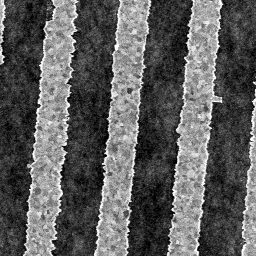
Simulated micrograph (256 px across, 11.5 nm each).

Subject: one or a few lines or trenches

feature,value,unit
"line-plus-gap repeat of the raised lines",823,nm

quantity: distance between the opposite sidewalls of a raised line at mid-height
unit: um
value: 0.326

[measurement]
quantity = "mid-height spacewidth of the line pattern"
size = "0.505 um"